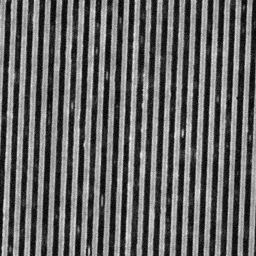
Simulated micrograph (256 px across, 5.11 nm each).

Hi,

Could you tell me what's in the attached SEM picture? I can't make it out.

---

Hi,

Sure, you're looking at parallel lines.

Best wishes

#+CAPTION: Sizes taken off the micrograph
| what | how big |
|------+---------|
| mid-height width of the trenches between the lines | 31.2 nanometres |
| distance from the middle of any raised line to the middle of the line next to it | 57.2 nm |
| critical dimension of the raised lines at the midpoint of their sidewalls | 5.11 px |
